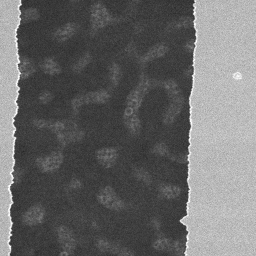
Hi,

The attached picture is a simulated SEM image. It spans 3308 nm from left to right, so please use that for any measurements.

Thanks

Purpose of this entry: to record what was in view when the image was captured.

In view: one or a few lines or trenches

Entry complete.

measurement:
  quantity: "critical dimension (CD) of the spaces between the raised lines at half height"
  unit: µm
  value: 2.25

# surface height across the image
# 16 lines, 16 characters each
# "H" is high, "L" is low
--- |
HLLLLLLLLLLLHHHH
HLLLLLLLLLLLHHHH
HLLLLLLLLLLLHHHH
HLLLLLLLLLLLHHHH
HLLLLLLLLLLLHHHH
HLLLLLLLLLLLHHHH
HLLLLLLLLLLLHHHH
HLLLLLLLLLLLHHHH
HLLLLLLLLLLLHHHH
HLLLLLLLLLLLHHHH
HLLLLLLLLLLLHHHH
HLLLLLLLLLLLHHHH
HLLLLLLLLLLLHHHH
HLLLLLLLLLLLHHHH
HLLLLLLLLLLLHHHH
HLLLLLLLLLLLHHHH